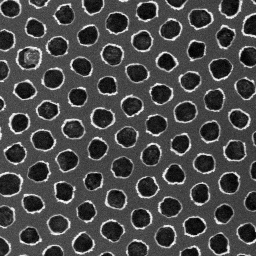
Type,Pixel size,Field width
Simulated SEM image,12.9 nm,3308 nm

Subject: a regular array of holes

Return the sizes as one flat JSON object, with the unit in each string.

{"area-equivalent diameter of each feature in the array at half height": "19.3 pixels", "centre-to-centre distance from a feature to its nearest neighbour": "395 nm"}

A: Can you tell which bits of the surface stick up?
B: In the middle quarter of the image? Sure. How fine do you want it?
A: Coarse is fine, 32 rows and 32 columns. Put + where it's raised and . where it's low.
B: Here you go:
++.....+++++++++....++++....++++
++.....+++++++++.....++++..+++++
++++..++++++++++.....+++++++++..
++++++++++..++++.....++++++++...
+++++++++....++++.+++++++++++...
++++++++.....++++++++++...+++...
++...++++....+++++++++.....++++.
+.....++++++++++++++++.....+++++
+.....++++++++++..++++.....+++++
++...++++++++++....++++...++++.+
+++.++++++++++......++++++++....
++++++++...++++....+++++++++....
+++++++.....++++..++++++++++....
+++++++.....+++++++++....+++....
+...+++.....+++++++++.....++++++
.....+++...++++++++++.....++++++
.....+++++++++....+++....+++++++
.....++++++++.....++++..++++++++
++..+++++++++.....+++++++++....+
+++++++...+++.....+++++++++....+
++++++.....++++..++++..++++....+
++++++.....+++++++++....++++...+
...+++....++++++++++....+++++.++
....+++..+++++..+++.....++++++++
....++++++++.....+++...+++++++++
...+++++++++.....++++++++++..+++
.+++++++++++.....+++++++++....++
++++++...++++....++++++++.....++
+++++....+++++++++++..+++.....++
+++++....++++++++++....+++...+++
..+++....+++++++++.....+++++++++
..++++++++++.++++++....+++++++++